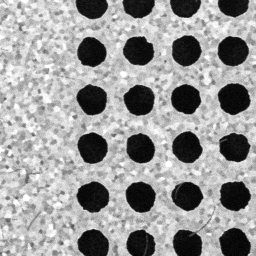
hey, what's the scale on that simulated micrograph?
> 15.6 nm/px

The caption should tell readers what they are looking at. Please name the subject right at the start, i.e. a regular array of holes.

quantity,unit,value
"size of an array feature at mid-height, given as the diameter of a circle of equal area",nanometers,481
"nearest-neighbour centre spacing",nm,733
